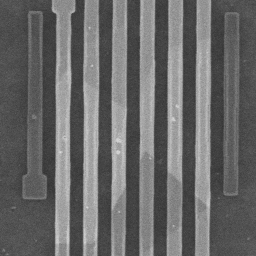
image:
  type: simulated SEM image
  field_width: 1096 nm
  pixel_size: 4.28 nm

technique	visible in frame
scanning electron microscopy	wiring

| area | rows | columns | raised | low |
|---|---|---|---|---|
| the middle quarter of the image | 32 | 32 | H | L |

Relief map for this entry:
HLLLLHHHHLLLHHHHLLLHHHHLLLHHHLLL
HHLLLHHHHLLLHHHHLLLHHHHLLLHHHLLL
HHLLLHHHHLLLHHHHLLLHHHHLLLHHHLLL
HHLLLHHHHLLLHHHHLLLHHHHLLLHHHLLL
HHLLLHHHHLLLHHHHLLLHHHHLLLHHHLLL
HLLLLHHHHLLLHHHHLLLHHHHLLLHHHLLL
HLLLLHHHHLLLHHHHLLLHHHLLLLHHHLLL
HLLLLHHHHLLLHHHHLLLHHHLLLLHHHLLL
HLLLLHHHHLLLHHHHLLLHHHLLLLHHHLLL
HLLLLHHHHLLLHHHHLLLHHHLLLLHHHLLL
HLLLLHHHHLLLHHHHLLLHHHLLLLHHHLLL
HLLLLHHHHLLLHHHHLLLHHHLLLLHHHLLL
HLLLLHHHHLLLHHHHLLLHHHLLLLHHHLLL
HLLLLHHHHLLLHHHLLLLHHHLLLLHHHLLL
HLLLLHHHHLLLHHHLLLLHHHLLLLHHHLLL
HLLLLHHHHLLLHHHLLLLHHHLLLLHHHLLL
HLLLLHHHHLLLHHHLLLLHHHLLLLHHHLLL
HLLLLHHHHLLLHHHLLLLHHHLLLLHHHLLL
HLLLLHHHHLLLHHHLLLLHHHLLLLHHHLLL
HLLLLHHHHLLLHHHLLLLHHHLLLLHHHLLL
HLLLLHHHHLLLHHHLLLLHHHLLLLHHHLLL
HLLLLHHHLLLLHHHLLLLHHHLLLLHHHLLL
HLLLLHHHLLLLHHHLLLLHHHLLLLHHHLLL
HLLLLHHHLLLLHHHLLLLHHHLLLLHHHLLL
HLLLLHHHLLLLHHHLLLLHHHLLLLHHHLLL
HLLLLHHHLLLLHHHLLLLHHHLLLLHHHLLL
HLLLLHHHLLLLHHHLLLLHHHLLLLHHHLLL
HLLLLHHHLLLLHHHLLLLHHHLLLLHHHLLL
HLLLLHHHLLLLHHHLLLLHHHLLLLHHHLLL
HLLLLHHHLLLLHHHLLLLHHHLLLLHHHLLL
HLLLLHHHLLLLHHHLLLLHHHLLLLHHHLLL
HLLLLHHHLLLLHHHLLLLHHHLLLLHHHLLL